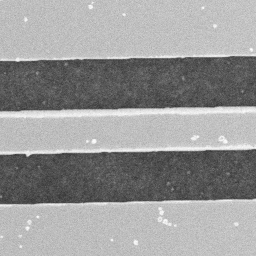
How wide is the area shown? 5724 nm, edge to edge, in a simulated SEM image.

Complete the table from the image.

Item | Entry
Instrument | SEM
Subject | lines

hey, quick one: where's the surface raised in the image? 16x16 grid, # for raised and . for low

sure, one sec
################
################
################
###############.
................
................
................
################
################
#######.........
................
................
...............#
################
################
################